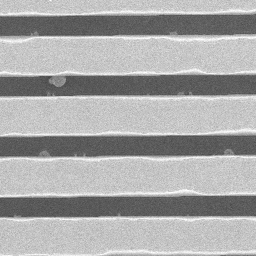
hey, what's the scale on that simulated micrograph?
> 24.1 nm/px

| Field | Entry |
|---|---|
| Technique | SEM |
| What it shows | lines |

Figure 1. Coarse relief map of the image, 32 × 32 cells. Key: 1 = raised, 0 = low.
11111111111111111111111111111111
11111111111111111111111111111111
00000000000000000000000000000000
00000000000000000000000000000000
00000000000000000000000000000000
11111111111111111111111111111111
11111111111111111111111111111111
11111111111111111111111111111111
11111111111111111111111111111111
00000000000000000000000000000000
00000000000000000000000000000000
00000000000000000000000000000000
11111111111111111111111111111111
11111111111111111111111111111111
11111111111111111111111111111111
11111111111111111111111111111111
11111111111111111111111111111111
00000000000000000000000000000000
00000000000000000000000000000000
00000000000000000000000000000000
11111111111111111111111111111111
11111111111111111111111111111111
11111111111111111111111111111111
11111111111111111111111111111111
11111111110000000000000000000000
00000000000000000000000000000000
00000000000000000000000000000000
11111111111111111111111111111111
11111111111111111111111111111111
11111111111111111111111111111111
11111111111111111111111111111111
11111111111111111111111111111111